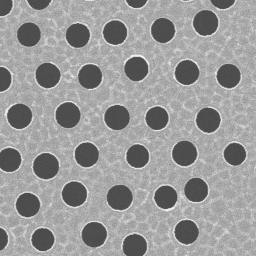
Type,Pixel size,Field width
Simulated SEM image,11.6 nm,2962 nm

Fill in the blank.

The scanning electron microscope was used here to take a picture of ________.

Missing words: a regular array of holes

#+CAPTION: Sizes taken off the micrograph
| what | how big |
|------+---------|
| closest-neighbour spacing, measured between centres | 41.5 pixels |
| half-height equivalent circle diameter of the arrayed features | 0.288 um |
